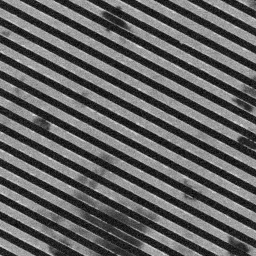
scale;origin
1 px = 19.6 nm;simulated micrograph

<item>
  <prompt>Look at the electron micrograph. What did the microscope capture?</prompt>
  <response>parallel lines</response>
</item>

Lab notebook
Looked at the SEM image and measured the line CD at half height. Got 152 nm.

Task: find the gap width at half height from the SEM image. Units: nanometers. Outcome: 152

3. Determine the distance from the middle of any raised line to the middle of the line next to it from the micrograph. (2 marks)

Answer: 0.307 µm